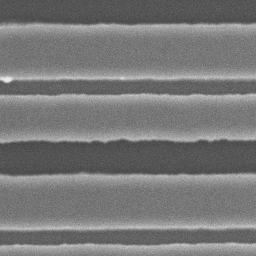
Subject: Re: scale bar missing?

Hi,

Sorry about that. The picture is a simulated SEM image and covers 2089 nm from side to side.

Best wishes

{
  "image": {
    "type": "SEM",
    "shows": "lines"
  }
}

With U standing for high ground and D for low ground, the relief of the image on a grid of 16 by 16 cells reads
DDDDDDDDDDDDDDDD
DDDDDDDDDDDDDDDD
UUUUUUUUUUUUUUUU
UUUUUUUUUUUUUUUU
UUUUUUUUUUUUUUUU
UUUUUUUUUUUUUUUU
UUUUUUUUUUUUUUUU
UUUUUUUUUUUUUUUU
UUUUUUUUUUUUUUUU
DDDDDDDDDDDDDDDD
DDDDDDDDDDDDDDDD
UUUUUUUUUUUUUUUU
UUUUUUUUUUUUUUUU
UUUUUUUUUUUUUUUU
UUUUUUUUUUUUUUUU
UUUUUUUUUUUUUUUU